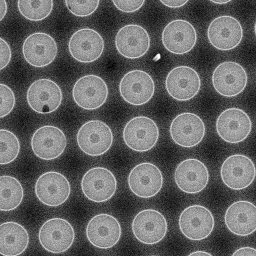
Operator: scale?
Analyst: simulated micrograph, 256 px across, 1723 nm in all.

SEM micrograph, an array of small figures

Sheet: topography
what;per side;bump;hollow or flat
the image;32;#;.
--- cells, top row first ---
.#....##....##....###..#########
.##...###..#####################
###########################..###
###############...###...##....##
####..###...###...##....##....##
.##....##....##....##...###...##
.##....##....##...####.#########
.##...####..####################
######################..###...##
################...##....##....#
####...###...##....##....##....#
.###....#....##....##....##...##
..##....#....###..##############
.###...####.####################
######################..####...#
###########..###...###...##....#
.####...##....##....#....##....#
..##....##....##....##...###..##
..##....##....###..#############
..###..######################.##
#######################..###....
###########...##....##....##....
..###...##....##....##....##....
...##....#....##....###..####.##
...##...###...####.#############
..####.######################..#
##################..###...##....
######..####..###....##....#....
...##....##....##....##....##...
...##....##....##...###...######
...##....###..##################
...###########################..